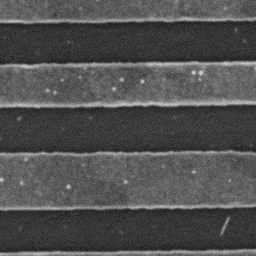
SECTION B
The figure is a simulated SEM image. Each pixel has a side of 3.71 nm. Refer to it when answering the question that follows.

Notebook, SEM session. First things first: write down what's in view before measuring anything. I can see lines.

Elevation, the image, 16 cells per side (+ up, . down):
++++++++++++++++
................
................
................
++++++++++++++++
++++++++++++++++
++++++++++++++++
................
................
...........++++.
++++++++++++++++
++++++++++++++++
++++++++++++++++
................
................
................